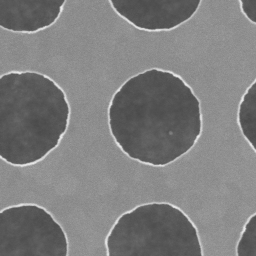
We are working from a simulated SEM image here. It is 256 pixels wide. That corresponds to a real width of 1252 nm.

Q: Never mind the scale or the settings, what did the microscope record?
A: holes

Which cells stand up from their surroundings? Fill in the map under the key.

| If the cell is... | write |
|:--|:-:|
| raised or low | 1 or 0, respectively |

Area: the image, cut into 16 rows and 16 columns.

0000111000001110
0001111100011111
1111111111111111
1111111111111111
1111111110111111
0000111100001111
0000111000001110
0000111000000110
0000111000001110
0001111100001111
1111111111111111
1111111111111111
1111111111111111
0001111100001111
0000111000001110
0000111000000110